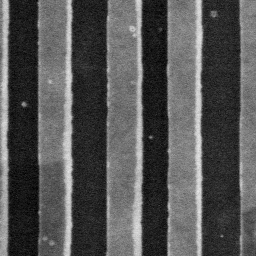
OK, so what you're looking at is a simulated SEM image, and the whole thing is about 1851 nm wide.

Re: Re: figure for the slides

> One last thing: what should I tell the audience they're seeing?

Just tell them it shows lines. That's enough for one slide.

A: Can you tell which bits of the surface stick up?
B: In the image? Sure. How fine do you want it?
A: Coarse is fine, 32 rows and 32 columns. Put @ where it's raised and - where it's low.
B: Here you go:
@----@@@@-----@@@@---@@@@-----@@
@----@@@@-----@@@@---@@@@-----@@
@----@@@@----@@@@@---@@@@-----@@
@----@@@@----@@@@@---@@@@-----@@
@----@@@@----@@@@@---@@@@-----@@
@----@@@@----@@@@@---@@@@-----@@
@----@@@@----@@@@@---@@@@-----@@
@----@@@@----@@@@@---@@@@-----@@
@----@@@@----@@@@@---@@@@-----@@
@----@@@@----@@@@@---@@@@-----@@
@----@@@@----@@@@@---@@@@-----@@
@----@@@@----@@@@@---@@@@-----@@
@----@@@@----@@@@@---@@@@-----@@
@----@@@@----@@@@@---@@@@-----@@
@----@@@@----@@@@@---@@@@-----@@
@----@@@@----@@@@@---@@@@-----@@
@----@@@@----@@@@@---@@@@-----@@
@----@@@@----@@@@@---@@@@-----@@
@----@@@@----@@@@@---@@@@-----@@
@----@@@@----@@@@@---@@@@-----@@
@----@@@@----@@@@@---@@@@-----@@
@----@@@@----@@@@@---@@@@-----@@
@----@@@@----@@@@@---@@@@-----@@
@----@@@@----@@@@@---@@@@-----@@
@----@@@@----@@@@@---@@@@-----@@
@----@@@@----@@@@----@@@@-----@@
@----@@@@----@@@@----@@@@-----@@
@----@@@@----@@@@----@@@@-----@@
@----@@@@----@@@@----@@@@-----@@
@----@@@@----@@@@----@@@@-----@@
@----@@@@----@@@@----@@@@-----@@
@----@@@@----@@@@----@@@@-----@@